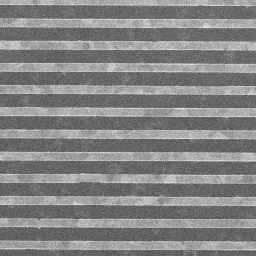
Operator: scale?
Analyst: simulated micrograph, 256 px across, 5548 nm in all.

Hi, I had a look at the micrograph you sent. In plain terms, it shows parallel lines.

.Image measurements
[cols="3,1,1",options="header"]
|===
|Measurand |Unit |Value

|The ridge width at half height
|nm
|168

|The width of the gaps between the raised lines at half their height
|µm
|0.311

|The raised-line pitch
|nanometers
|481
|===